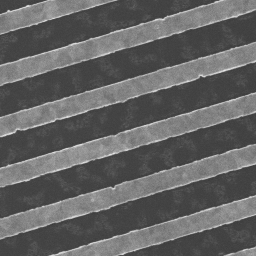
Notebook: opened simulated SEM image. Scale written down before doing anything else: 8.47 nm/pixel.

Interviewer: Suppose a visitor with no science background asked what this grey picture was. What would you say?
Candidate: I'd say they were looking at parallel lines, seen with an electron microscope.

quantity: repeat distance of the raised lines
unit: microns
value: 0.416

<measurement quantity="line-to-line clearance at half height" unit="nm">259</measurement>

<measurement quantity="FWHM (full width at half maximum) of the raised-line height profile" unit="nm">160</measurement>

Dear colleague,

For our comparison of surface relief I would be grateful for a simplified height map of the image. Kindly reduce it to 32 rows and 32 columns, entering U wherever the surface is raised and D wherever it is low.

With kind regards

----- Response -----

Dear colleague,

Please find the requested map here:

DDDDDUUUUUUUUDDDDDDDDDDDDDUUUUUU
DUUUUUUUUDDDDDDDDDDDDDDUUUUUUUUD
UUUUUUDDDDDDDDDDDDDUUUUUUUUUDDDD
UUDDDDDDDDDDDDDDUUUUUUUUDDDDDDDD
DDDDDDDDDDDDDUUUUUUUUDDDDDDDDDDD
DDDDDDDDDUUUUUUUUUDDDDDDDDDDDDDU
DDDDDDUUUUUUUUDDDDDDDDDDDDDDUUUU
DDUUUUUUUUUDDDDDDDDDDDDDUUUUUUUU
UUUUUUUDDDDDDDDDDDDDDUUUUUUUUDDD
UUUUDDDDDDDDDDDDDDUUUUUUUUDDDDDD
UDDDDDDDDDDDDDUUUUUUUUDDDDDDDDDD
DDDDDDDDDDDUUUUUUUUDDDDDDDDDDDDD
DDDDDDDUUUUUUUUUDDDDDDDDDDDDDUUU
DDDDUUUUUUUUDDDDDDDDDDDDDDUUUUUU
DUUUUUUUUDDDDDDDDDDDDDUUUUUUUUDD
UUUUUDDDDDDDDDDDDDDUUUUUUUUDDDDD
UUDDDDDDDDDDDDDUUUUUUUUDDDDDDDDD
DDDDDDDDDDDDUUUUUUUUDDDDDDDDDDDD
DDDDDDDDDUUUUUUUUDDDDDDDDDDDDDUU
DDDDDUUUUUUUUDDDDDDDDDDDDDDUUUUU
DDUUUUUUUUDDDDDDDDDDDDDUUUUUUUUU
UUUUUUDDDDDDDDDDDDDDUUUUUUUUDDDD
UUUUDDDDDDDDDDDDDUUUUUUUUDDDDDDD
DDDDDDDDDDDDDUUUUUUUUUDDDDDDDDDD
DDDDDDDDDDUUUUUUUUDDDDDDDDDDDDDD
DDDDDDUUUUUUUUUDDDDDDDDDDDDDUUUU
DDDUUUUUUUUDDDDDDDDDDDDDDUUUUUUU
UUUUUUUUDDDDDDDDDDDDDDUUUUUUUUDD
UUUUUDDDDDDDDDDDDDUUUUUUUUDDDDDD
UDDDDDDDDDDDDDDUUUUUUUUDDDDDDDDD
DDDDDDDDDDDUUUUUUUUUDDDDDDDDDDDD
DDDDDDDDUUUUUUUUDDDDDDDDDDDDDDUU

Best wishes